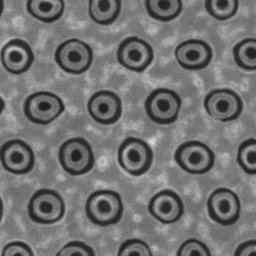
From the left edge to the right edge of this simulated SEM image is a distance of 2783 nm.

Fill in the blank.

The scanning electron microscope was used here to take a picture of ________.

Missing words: a regular array of ring-shaped grooves with a dot in the middle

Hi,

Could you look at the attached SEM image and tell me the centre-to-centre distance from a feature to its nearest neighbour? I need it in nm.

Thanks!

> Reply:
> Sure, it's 622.